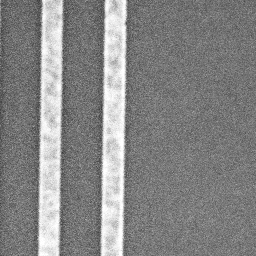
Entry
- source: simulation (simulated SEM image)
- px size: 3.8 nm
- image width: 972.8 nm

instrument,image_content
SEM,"one or a few lines or trenches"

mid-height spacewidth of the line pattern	169	nanometres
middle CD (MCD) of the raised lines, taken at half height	0.0694	um